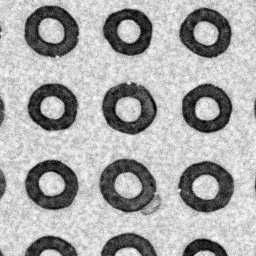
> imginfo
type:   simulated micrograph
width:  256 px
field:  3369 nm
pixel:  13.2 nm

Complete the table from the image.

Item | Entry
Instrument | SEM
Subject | a regular array of ring-shaped grooves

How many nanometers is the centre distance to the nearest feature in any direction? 996